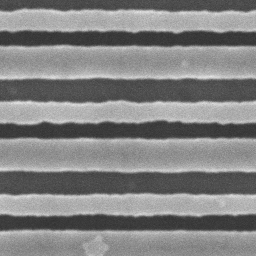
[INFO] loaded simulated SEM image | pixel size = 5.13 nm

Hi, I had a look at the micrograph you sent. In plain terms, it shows lines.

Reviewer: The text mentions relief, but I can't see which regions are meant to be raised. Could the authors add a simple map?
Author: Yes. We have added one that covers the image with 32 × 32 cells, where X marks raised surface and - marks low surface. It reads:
--------------------------------
XXXXXXXXXXXXXXXXXXXXX-XXXX--XX-X
XXXXXXXXXXXXXXXXXXXXXXXXXXXXXXXX
XXXXXXXXXXXXXXXXXXXXXXXXXXXXXXXX
--------------------------------
--------------------------------
XXXXXXXXXXXXXXXXXXXXXXXXXXXXXXXX
XXXXXXXXXXXXXXXXXXXXXXXXXXXXXXXX
XXXXXXXXXXXXXXXXXXXXXXXXXXXXXXXX
XXXXXXXXXXXXXXXXXXXXXXXXXXXXXXXX
--------------------------------
--------------------------------
--------------------------------
XXXXXXXXXXXXXXXXXXXXXXXXXXXXXXXX
XXXXXXXXXXXXXXXXXXXXXXXXXXXXXXXX
--------------------------------
--------------------------------
XXXXXXXXXXXXXXXXXXXXXXXXXXXXXXXX
XXXXXXXXXXXXXXXXXXXXXXXXXXXXXXXX
XXXXXXXXXXXXXXXXXXXXXXXXXXXXXXXX
XXXXXXXXXXXXXXXXXXXXXXXXXXXXXXXX
--------------------------------
--------------------------------
--------------------------------
XXXXXXXXXXXXXXXXXXXXXXXXXXXXXXXX
XXXXXXXXXXXXXXXXXXXXXXXXXXXXXXXX
XXXXXXXXXXXXXXXXXXXXXXXXXXXXXXXX
--------------------------------
--------------------------------
XXXXXXXXXXXXXXXXXXXXXXXXXXXXXXXX
XXXXXXXXXXXXXXXXXXXXXXXXXXXXXXXX
XXXXXXXXXXXXXXXXXXXXXXXXXXXXXXXX